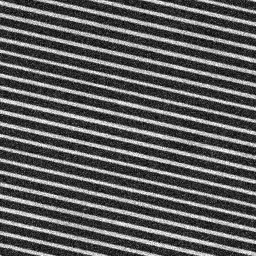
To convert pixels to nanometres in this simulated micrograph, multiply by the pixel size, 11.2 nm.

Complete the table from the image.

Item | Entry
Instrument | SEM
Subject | parallel lines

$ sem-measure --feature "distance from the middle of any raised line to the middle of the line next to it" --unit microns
0.132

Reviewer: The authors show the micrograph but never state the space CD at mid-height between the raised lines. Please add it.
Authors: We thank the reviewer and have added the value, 95.2 nm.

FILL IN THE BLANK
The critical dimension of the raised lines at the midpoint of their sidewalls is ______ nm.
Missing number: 28.6